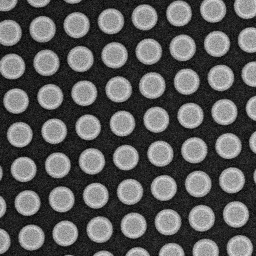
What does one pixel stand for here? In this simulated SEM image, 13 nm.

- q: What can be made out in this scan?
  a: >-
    an array of small figures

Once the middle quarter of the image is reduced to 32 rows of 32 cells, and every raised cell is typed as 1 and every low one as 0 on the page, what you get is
01111110000111000000000000000000
00111100000000000000000000000111
00000000000000000000011100001111
00000000000011100001111110001111
00001110000111110001111110001111
00111111001111111001111110001111
00111111001111111001111110001111
00111111000111111001111110000011
00111111000111110000011000000000
00011110000001000000000000000000
00000000000000000000000000000011
00000000000000000000011110000111
00000000000001111000111111001111
00001111000011111000111111001111
00011111100011111100111111000111
00011111100011111100111111000011
10011111100011111000011110000000
10011111100001110000000000000000
00001111000000000000000000000000
00000000000000000000000110000011
00000000000000111000011111100011
00000111100001111100011111100111
00001111110011111110011111100111
10001111110011111110011111100011
11001111110011111100001111100001
11001111110001111100000110000000
10000111100000010000000000000000
10000010000000000000000000000001
00000000000000000000000111100001
00000000000000111110001111110011
00000011110000111110001111110011
10000111111001111111001111110001